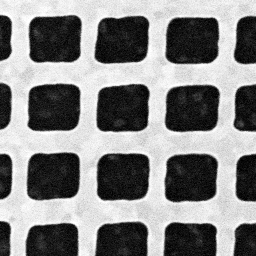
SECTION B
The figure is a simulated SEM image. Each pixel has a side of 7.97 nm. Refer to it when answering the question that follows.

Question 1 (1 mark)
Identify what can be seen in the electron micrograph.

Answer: a regular array of holes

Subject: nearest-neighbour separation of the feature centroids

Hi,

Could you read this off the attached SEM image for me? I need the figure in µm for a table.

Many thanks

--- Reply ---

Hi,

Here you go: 0.542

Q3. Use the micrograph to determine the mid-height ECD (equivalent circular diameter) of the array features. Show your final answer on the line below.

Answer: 440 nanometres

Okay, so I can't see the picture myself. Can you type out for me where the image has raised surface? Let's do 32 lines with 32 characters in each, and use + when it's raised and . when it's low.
++++++++++++++++++++++++++++++++
++++++++++++++++++++++++++++++++
.+++......+++.....+++......+++..
..++......++.......++......++...
.+++......++.......++......++...
.+++......++.......++......++...
.+++......++......+++......++...
.+++......++......+++......++...
++++++++++++++++++++++++++++++++
++++++++++++++++++++++++++++++++
.+++++...+++++++..++++++++++++++
.+++......++.......++.......++..
..++......++.......++.......+...
.++.......++.......++......++...
.+++......++.......++......++...
.++.......++.......++......++...
+++++++++++++....+++++.++++++++.
++++++++++++++++++++++++++++++++
++++++++++++++++++++++++++++++++
.+++......+++.....++++.....+++..
..+.......++.......++......+++..
..+.......++.......++......++...
..+.......++.......+.......++...
.++.......++.......+.......++...
.+++.....+++......+++......+++..
++++++++++++++++++++++++++++++++
++++++++++++++++++++++++++++++++
++++++++++++++++++++++++++++++++
.+++......++......+++......+++..
.++.......++.......+.......++...
.++.......++......++.......++...
.++.......++.......+.......++...